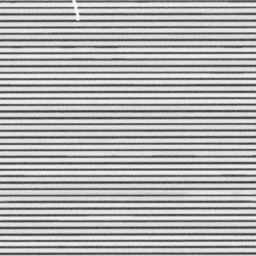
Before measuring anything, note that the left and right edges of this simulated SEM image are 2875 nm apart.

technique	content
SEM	parallel lines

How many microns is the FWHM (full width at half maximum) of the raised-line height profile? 0.0435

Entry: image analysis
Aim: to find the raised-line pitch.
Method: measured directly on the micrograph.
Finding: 72.5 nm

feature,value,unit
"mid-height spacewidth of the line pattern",32.3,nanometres